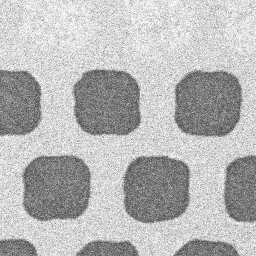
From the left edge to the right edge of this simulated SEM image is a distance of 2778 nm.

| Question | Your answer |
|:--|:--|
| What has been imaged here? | holes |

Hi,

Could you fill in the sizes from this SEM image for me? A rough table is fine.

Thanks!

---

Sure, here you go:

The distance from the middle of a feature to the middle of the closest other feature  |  1.08 um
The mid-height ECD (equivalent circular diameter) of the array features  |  0.769 micrometres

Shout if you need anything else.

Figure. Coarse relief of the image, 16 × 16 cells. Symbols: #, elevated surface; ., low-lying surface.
################
################
################
################
..####..####..##
...##....##....#
...##....##....#
...##....##....#
############..##
################
##....##....##..
#.....##....##..
#.....##....##..
##...###...###..
################
..###...###....#